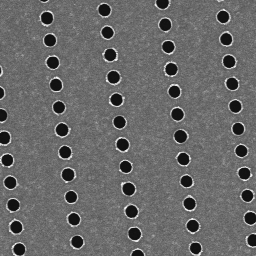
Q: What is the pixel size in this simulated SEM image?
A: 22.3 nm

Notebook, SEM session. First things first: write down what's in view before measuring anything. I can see a regular array of holes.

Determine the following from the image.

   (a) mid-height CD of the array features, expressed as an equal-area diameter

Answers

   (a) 269 nm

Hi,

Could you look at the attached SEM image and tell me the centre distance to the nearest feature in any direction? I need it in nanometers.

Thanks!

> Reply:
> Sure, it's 501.